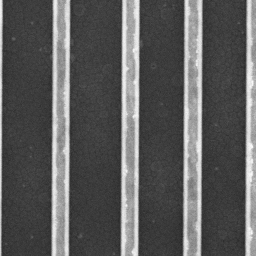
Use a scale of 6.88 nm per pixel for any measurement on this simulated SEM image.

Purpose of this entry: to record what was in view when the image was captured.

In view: one or a few lines or trenches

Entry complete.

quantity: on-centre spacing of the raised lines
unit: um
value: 0.453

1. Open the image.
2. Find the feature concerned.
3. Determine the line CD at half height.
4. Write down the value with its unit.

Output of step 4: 92 nm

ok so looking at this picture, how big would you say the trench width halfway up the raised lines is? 48.8 pixels